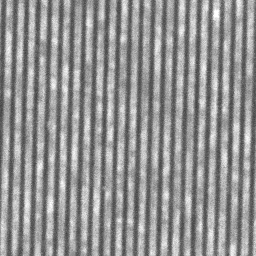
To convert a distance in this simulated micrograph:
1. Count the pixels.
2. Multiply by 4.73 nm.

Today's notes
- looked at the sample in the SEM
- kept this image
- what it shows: parallel lines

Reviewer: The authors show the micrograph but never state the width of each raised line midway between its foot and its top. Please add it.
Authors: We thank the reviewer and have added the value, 5.01 pixels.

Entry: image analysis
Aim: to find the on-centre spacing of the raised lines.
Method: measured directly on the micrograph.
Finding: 54.4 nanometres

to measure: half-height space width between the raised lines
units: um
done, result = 0.0319